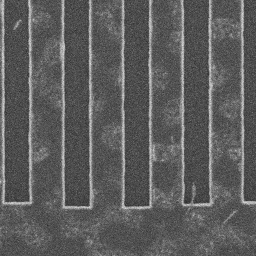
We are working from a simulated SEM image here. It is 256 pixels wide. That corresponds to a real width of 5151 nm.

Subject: parallel lines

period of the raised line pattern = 1200 nanometers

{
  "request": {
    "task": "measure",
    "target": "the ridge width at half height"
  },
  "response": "0.682 microns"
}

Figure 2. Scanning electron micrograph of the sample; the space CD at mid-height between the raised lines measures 526 nm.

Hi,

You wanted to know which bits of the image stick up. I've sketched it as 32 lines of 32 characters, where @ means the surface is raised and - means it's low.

----@@@@---@@@@----@@@@---@@@@--
----@@@@---@@@@----@@@@---@@@@--
----@@@@---@@@@----@@@@---@@@@--
----@@@@---@@@@----@@@@---@@@@--
----@@@@---@@@@----@@@@---@@@@--
----@@@@---@@@@----@@@@---@@@@--
----@@@@---@@@@----@@@@---@@@@--
----@@@@---@@@@----@@@@---@@@@--
----@@@@---@@@@----@@@@---@@@@--
----@@@@---@@@@----@@@@---@@@@--
----@@@@---@@@@----@@@@---@@@@--
----@@@@---@@@@----@@@@---@@@@--
----@@@@---@@@@----@@@@---@@@@--
----@@@@---@@@@----@@@@---@@@@--
----@@@@---@@@@----@@@@---@@@@--
----@@@@---@@@@----@@@@---@@@@--
----@@@@---@@@@----@@@@---@@@@--
----@@@@---@@@@----@@@@---@@@@--
----@@@@---@@@@----@@@@---@@@@--
----@@@@---@@@@----@@@@---@@@@--
----@@@@---@@@@----@@@@---@@@@--
----@@@@---@@@@----@@@@---@@@@--
@---@@@@---@@@@----@@@@---@@@@--
----@@@@---@@@@----@@@@---@@@@--
----@@@@---@@@@----@@@@---@@@@--
@@@@@@@@---@@@@----@@@@@@-@@@@@@
@@@@@@@@@@@@@@@@@@@@@@@@@@@@@@@@
@@@@@@@@@@@@@@@@@@@@@@@@@@@@@@@@
@@@@@@@@@@@@@@@@@@@@@@@@@@@@@@@@
@@@@@@@@@@@@@@@@@@@@@@@@@@@@@@@@
@@@@@@@@@@@@@@@@@@@@@@@@@@@@@@@@
@@@@@@@@@@@@@@@@@@@@@@@@@@@@@@@@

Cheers